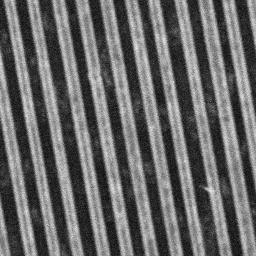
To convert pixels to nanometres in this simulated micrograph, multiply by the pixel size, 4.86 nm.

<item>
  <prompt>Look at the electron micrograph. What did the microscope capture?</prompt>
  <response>parallel lines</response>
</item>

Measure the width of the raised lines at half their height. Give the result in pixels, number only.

9.22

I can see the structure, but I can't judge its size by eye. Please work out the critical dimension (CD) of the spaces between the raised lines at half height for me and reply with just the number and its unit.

69.9 nanometres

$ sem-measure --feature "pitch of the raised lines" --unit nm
116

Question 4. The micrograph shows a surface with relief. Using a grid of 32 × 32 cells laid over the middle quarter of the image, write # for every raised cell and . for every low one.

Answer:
###...###...###....##...##.....#
###...###...###....##...###....#
.##...###....##....##....##.....
.##....##....##....###...##.....
.##....##....##....###...##.....
.###...##....###...###...##.....
.###...###...###....##...###....
..##....##....##....##....##....
..##....##....##....##....##....
..##....##....##....###...##....
..###...##....###...###...##....
..###...##....###...###...##....
..###...###...###....##...###...
...##....##....##....##....##...
...##....##....##....##....##...
...##....##....##....###...##...
...###...##....###...###...##...
...###...###...###....##...##...
...###...###....##....##....##..
....##....##....##....##....##..
....##....##....##....###...##..
....##....##....###...###...##..
....###...##....###...###...##..
....###...###...###....##...###.
.....##....##....##....##....##.
.....##....##....##....##....##.
#....##....##....##....###...##.
#....###...##....###...###...##.
#....###...###...###....##...##.
#....###...###...###....##...###
#.....##....##....##....##....##
#.....##....##....##....###...##